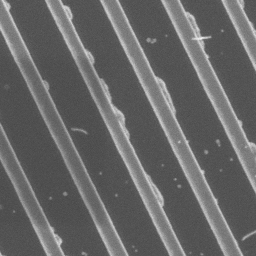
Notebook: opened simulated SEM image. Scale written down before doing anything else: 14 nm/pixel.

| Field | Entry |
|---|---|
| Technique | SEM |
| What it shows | lines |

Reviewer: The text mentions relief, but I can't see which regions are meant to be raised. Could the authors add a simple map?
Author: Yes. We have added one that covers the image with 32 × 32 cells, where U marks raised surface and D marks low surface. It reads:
UDDDDDUUDDDDDUUDDDDDDUUDDDDDUUDD
UDDDDDDUDDDDDUUDDDDDDUUDDDDDDUUD
UUDDDDDUUDDDDDUUDDDDDDUUDDDDDUUD
UUDDDDDUUDDDDDUUDDDDDDUUUDDDDDUU
DUUDDDDDUUDDDDDUUDDDDDUUUDDDDDUU
DUUDDDDDUUDDDDDUUDDDDDDUUDDDDDUU
DUUUDDDDDUUDDDDDUUDDDDDUUUDDDDDU
DDUUDDDDDUUDDDDDUUDDDDDDUUDDDDDU
DDUUUDDDDDUUDDDDDUUDDDDDUUUDDDDD
DDDUUDDDDDUUDDDDDUUDDDDDDUUDDDDD
DDDDUUDDDDDUUDDDDDUUDDDDDUUUDDDD
DDDDUUDDDDDUUDDDDDUUUDDDDDUUDDDD
DDDDUUUDDDDDUUDDDDDUUDDDDDUUUDDD
DDDDDUUDDDDDUUDDDDDUUDDDDDDUUDDD
DDDDDUUDDDDDDUUDDDDDUUDDDDDUUUDD
DDDDDDUUDDDDDUUDDDDDUUDDDDDDUUDD
UDDDDDUUDDDDDDUUDDDDDUUDDDDDUUDD
UDDDDDDUUDDDDDUUDDDDDUUDDDDDDUUD
UDDDDDDUUDDDDDDUUDDDDDUUDDDDDUUU
UUDDDDDDUUDDDDDUUDDDDDUUDDDDDDUU
UUDDDDDDUUDDDDDDUUDDDDDUUDDDDDUU
DUUDDDDDDUUDDDDDUUDDDDDUUDDDDDDU
DUUDDDDDDUUDDDDDDUUDDDDDUUDDDDDU
DDUUDDDDDDUUDDDDDUUDDDDDUUDDDDDD
DDUUDDDDDDUUDDDDDDUUDDDDDUUDDDDD
DDDUUDDDDDDUUDDDDDUUDDDDDUUDDDDD
DDDUUDDDDDDUUDDDDDDUUDDDDDUUDDDD
DDDDUUDDDDDDUUDDDDDUUDDDDDUUDDDD
DDDDUUDDDDDDUUDDDDDDUUDDDDDUUDDD
DDDDDUUDDDDDDUUDDDDDUUDDDDDUUDDD
DDDDDUUDDDDDDUUDDDDDDUDDDDDDUUDD
DDDDDDUUDDDDDDUUDDDDDUUDDDDDUUDD